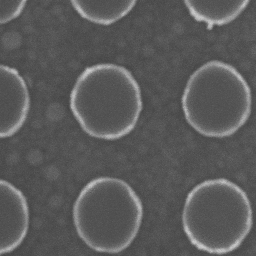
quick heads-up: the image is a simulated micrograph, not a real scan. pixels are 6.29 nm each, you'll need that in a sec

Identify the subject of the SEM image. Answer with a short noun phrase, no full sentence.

raised bodies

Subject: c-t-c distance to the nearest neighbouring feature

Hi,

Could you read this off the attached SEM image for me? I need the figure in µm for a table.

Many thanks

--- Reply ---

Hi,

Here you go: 0.689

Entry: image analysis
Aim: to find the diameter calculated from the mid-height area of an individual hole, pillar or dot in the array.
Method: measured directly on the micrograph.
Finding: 442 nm